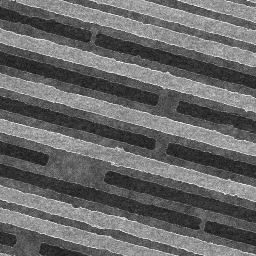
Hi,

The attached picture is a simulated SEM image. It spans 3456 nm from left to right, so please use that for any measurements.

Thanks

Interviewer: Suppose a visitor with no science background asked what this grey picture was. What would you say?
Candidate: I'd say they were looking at parallel lines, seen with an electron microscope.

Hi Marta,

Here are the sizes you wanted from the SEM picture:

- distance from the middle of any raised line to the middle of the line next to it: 0.292 microns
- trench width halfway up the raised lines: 112 nm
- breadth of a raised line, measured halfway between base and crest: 0.182 microns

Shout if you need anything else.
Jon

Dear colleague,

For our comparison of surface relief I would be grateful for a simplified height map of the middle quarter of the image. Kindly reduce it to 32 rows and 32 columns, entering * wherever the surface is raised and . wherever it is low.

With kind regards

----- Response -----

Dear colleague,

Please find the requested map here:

......*************.......******
*........*************........**
****.........**************.....
*********........************...
************........************
...*************........********
.......*************........****
**.........************.........
*******.......**********........
***********.......******.....**.
.*************........*.....****
.....************...........****
.........************........***
****........**************......
*******.........************....
***********.........************
...************........*********
.......************........*****
**........************.........*
******........*********.........
*********.........*****...****..
***************..........*******
....*************.........******
.......*************........****
...........*************........
.............*.*************....
..................**************
..........****.........*********
..........********.........*****
*.........************........**
*****........************.......
*********.......*************...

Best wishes